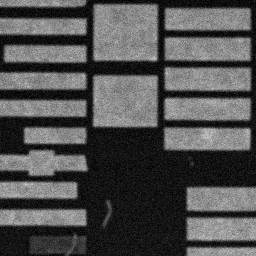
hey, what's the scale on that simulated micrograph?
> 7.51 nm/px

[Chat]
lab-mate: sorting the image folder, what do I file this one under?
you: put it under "wiring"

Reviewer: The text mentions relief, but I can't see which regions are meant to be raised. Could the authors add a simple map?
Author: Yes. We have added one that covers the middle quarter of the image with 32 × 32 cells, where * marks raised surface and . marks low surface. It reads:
................................
.........................*******
.........................*******
*****...***************..*******
*****...***************..*******
*****...***************..*******
........***************.........
........***************.........
........***************.........
*****...***************..*******
*****...*******.*******..*******
*****...***************..*******
*****...***************..*******
........***************..*******
.......****************.........
................................
*****....................*******
*****....................*******
*****....................*******
*****....................*******
.........................*******
................................
................................
*****...........................
*****...........................
*****...........................
....**..........................
................................
................................
................................
***.............................
***............................*